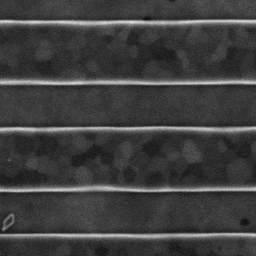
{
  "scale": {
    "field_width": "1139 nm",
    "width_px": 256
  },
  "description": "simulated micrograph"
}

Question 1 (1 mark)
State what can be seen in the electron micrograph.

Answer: wiring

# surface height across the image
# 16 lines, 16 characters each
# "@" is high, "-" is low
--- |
----------------
@@@@@@@@@@@@@@@@
@@@@@@@@@@@@@@@@
@@@@@@@@@@@@@@@@
@@@@@@@@@@@@@@@@
----------------
----------------
----------------
@@@@@@@@@@@@@@@@
@@@@@@@@@@@@@@@@
@@@@@@@@@@@@@@@@
@@@@@@@@@@@@@@@@
----------------
----------------
----------------
@@@@@@@@@@@@@@@@